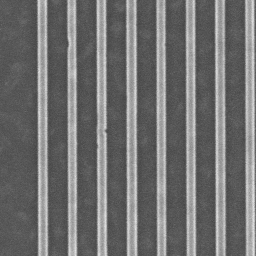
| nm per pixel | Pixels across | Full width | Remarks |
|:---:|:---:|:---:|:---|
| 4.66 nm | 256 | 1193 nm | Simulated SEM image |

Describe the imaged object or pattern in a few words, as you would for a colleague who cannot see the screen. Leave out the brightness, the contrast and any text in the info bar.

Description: parallel lines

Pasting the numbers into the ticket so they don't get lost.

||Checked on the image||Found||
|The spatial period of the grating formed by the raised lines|138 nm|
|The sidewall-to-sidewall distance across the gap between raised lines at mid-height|102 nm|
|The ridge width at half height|35.5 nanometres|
